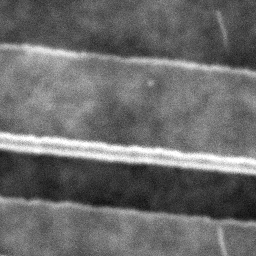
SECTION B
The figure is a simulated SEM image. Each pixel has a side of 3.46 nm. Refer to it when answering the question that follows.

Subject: lines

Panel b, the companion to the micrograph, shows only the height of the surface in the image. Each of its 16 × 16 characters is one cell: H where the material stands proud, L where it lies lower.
LLLLLLLLLLLLLLLL
LLLLLLLLLLLLLLLL
LLLLLLLLLLLLLLLL
HHHHHHHLLLLLLLLL
HHHHHHHHHHHHHHHH
HHHHHHHHHHHHHHHH
HHHHHHHHHHHHHHHH
HHHHHHHHHHHHHHHH
HHHHHHHHHHHHHHHH
LLHHHHHHHHHHHHHH
LLLLLLLLLLLLLHHH
LLLLLLLLLLLLLLLL
HLLLLLLLLLLLLLLL
HHHHHHHHHHHLLLLL
HHHHHHHHHHHHHHHH
HHHHHHHHHHHHHHHH